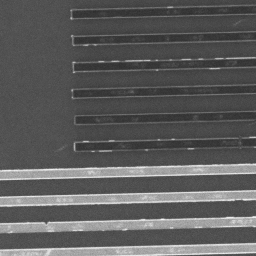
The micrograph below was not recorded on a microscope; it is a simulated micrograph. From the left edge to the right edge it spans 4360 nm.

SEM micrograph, parallel lines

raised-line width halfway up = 158 nm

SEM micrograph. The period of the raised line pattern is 451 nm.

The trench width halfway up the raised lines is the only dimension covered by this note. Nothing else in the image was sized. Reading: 17.6 px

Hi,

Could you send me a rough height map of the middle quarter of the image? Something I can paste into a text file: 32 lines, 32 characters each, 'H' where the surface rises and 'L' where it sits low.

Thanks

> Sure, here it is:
LLLHHHHHHHHHHHHHHHHHHHHHHHHHHHHH
LLLHHHHHHHHHHHHHHLLLLLLLLLLLLLLL
LLLLLLLLLLLLLLLLLLLLLLLLLLLLLLLL
LLLLLLLLLLLLLLLLLLLLLLLLLLLLLLLL
LLLLLLLLLLLLLLLLLLLLLLLLLLLLLLLL
LLLLLLLLLLLLLLLLLLLLLLLLLLLLLLLL
LLHHHHHHHHHHHHHHHHHHHHHHHHHHHHHH
LLHHHHHHHHHHHHHHHHHHHHHHHHHHHHHH
LLLLHLLLLLLLLLLLLLLLLLLLLLLLLLLL
LLLLLLLLLLLLLLLLLLLLLLLLLLLLLLLL
LLLLLLLLLLLLLLLLLLLLLLLLLLLLLLLL
LLLLLLLLLLLLLLLLLLLLLLLLLLLLLLLL
LLLLLLLLLLLLLLLLLLLLLHHHHHHHHHHH
LLLHHHHHHHHHHHHHHHHHHHHHHHHHHHHH
LLLHHHHHHHHHHHHHHHHHHHHHLLLLLLLL
LLLLLLLLLLLLLLLLLLLLLLLLLLLLLLLL
LLLLLLLLLLLLLLLLLLLLLLLLLLLLLLLL
LLLLLLLLLLLLLLLLLLLLLLLLLLLLLLLL
LLLLLLLLLLLLLLLLLLLLLLLLLLLLLLLL
LLLLLLLLLHHHHHHHHHHHHHHHHHHHHHHH
LLLHHHHHHHHHHHHHHHHHHHHHHHHHHHHH
LLLHHHHHHHHHLLLLLLLLLLLLLLLLLLLL
LLLLLLLLLLLLLLLLLLLLLLLLLLLLLLLL
LLLLLLLLLLLLLLLLLLLLLLLLLLLLLLLL
LLLLLLLLLLLLLLLLLLLLLLLLLLLLLLLL
LLLLLLLLLLLLLLLLLLLLLLLLLLLLLLLL
HHHHHHHHHHHHHHHHHHHHHHHHHHHHHHHH
HHHHHHHHHHHHHHHHHHHHHHHHHHHHHHHH
LLLLLLLLLLLLLLLLLLLLLLLLLLLLLLLL
LLLLLLLLLLLLLLLLLLLLLLLLLLLLLLLL
LLLLLLLLLLLLLLLLLLLLLLLLLLLLLLLL
LLLLLLLLLLLLLLLLLLLLLLLLLLLLLLLL